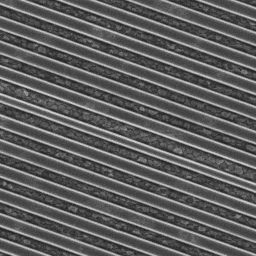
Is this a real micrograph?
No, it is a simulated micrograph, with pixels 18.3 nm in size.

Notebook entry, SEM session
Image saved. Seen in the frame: parallel lines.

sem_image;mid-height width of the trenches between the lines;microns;0.213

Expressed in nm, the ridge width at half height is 213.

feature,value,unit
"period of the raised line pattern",425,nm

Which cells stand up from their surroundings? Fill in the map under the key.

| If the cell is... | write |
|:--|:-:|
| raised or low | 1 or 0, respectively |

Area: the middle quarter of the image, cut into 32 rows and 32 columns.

11000000000111111110000000001111
11111000000001111111110000000011
11111110000000001111111110000000
00111111110000000011111111110000
00001111111110000000011111111110
00000001111111110000000011111111
10000000001111111110000000011111
11110000000001111111110000000011
11111110000000001111111100000000
01111111110000000001111111100000
00001111111110000000011111111100
00000001111111100000000011111111
00000000011111111100000000011111
10000000000011111111100000000011
11110000000000011111111100000000
01111110000000000011111111100000
00001111110000000000011111111100
00000001111110000000000011111111
00000000001111100000000000111111
11100000000011111100000000000111
11111100000000011111100000000000
11111111000000000011111100000000
00011111111000000000011111100000
00000111111111000000000011111100
00000000111111111100000000011111
11100000000111111111000000000111
11111100000000111111111000000000
11111111100000000111111111000000
00011111111000000000111111111000
00000111111111000000000111111111
00000000111111110000000000111111
11000000000111111110000000000111